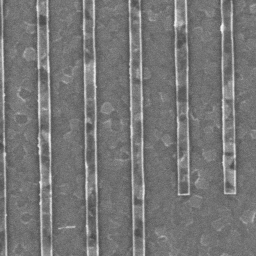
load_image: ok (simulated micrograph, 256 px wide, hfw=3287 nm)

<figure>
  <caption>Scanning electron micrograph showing parallel lines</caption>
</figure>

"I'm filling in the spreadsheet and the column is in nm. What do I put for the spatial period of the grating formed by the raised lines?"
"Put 592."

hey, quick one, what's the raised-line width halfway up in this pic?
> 144 nm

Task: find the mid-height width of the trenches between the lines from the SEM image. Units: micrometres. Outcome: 0.446